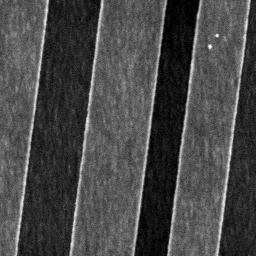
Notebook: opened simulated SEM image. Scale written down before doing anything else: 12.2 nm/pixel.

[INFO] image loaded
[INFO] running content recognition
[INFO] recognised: lines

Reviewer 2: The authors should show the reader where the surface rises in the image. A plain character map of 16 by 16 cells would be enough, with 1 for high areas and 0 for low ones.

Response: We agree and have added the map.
1110001111001111
1110001111001110
1110001111001110
1110001111001110
1100001111001110
1100001111001110
1100001111001110
1100011110001110
1100011110011110
1100011110011100
1100011110011100
1100011110011100
1000011110011100
1000011110011100
1000011110011100
1000111100011100